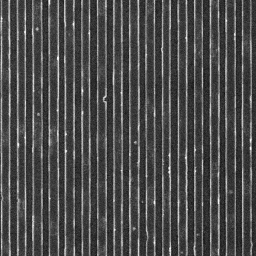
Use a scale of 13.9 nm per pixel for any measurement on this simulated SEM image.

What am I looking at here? parallel lines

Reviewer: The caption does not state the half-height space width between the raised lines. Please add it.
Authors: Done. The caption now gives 97.4 nm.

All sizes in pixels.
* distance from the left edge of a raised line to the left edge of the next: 16.1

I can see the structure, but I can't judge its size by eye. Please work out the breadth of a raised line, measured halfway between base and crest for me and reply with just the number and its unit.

0.131 µm